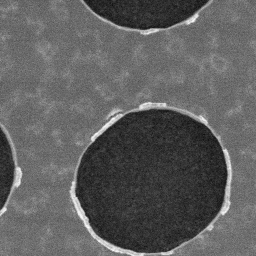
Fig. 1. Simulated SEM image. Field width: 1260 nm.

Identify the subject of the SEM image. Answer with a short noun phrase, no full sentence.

holes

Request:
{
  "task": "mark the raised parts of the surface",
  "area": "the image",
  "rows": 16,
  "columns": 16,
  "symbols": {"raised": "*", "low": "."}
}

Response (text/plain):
******.......***
*******....*****
****************
****************
****************
****************
****************
*******.....****
******.......***
.****.........**
.****.........**
.****.........**
*****.........**
*****.........**
******.......***
********...*****